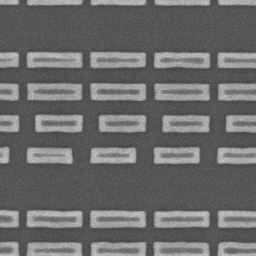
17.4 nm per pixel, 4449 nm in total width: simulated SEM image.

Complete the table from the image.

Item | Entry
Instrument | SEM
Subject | wiring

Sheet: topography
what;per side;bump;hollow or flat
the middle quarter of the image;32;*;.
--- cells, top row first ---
................................
................................
................................
................................
................................
................................
****...*************...*********
****...*************...*********
................................
................................
................................
................................
................................
..**............................
****......**********.....*******
****......**********......******
................................
................................
................................
................................
................................
................................
*.......*********......*********
*.......*********......*********
................................
................................
................................
................................
................................
................................
................................
................................